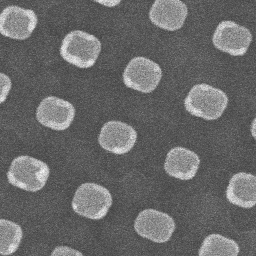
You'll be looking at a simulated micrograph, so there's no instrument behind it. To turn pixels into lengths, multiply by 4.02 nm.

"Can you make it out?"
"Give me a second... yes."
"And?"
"a regular array of raised bodies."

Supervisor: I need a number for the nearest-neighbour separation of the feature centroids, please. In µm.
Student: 0.267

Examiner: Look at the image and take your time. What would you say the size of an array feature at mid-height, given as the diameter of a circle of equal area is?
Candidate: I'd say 142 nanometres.